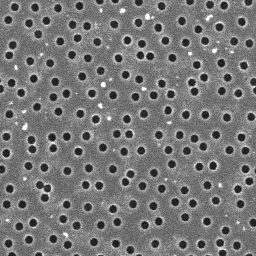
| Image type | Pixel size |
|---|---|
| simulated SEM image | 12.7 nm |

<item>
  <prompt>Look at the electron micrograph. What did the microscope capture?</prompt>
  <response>a regular array of holes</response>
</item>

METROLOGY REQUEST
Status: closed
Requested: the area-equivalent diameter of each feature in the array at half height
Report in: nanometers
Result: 106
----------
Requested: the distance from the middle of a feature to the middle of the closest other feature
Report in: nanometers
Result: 199